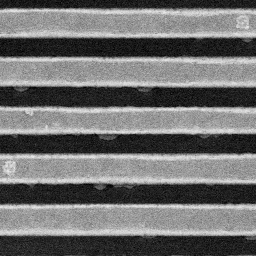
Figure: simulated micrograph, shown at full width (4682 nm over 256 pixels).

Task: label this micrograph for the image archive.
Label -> lines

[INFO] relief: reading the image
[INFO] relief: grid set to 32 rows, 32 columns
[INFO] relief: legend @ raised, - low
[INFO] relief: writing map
--------------------------------
@@@@@@@@@@@@@@@@@@@@@@@@@@@@@@@@
@@@@@@@@@@@@@@@@@@@@@@@@@@@@@@@@
@@@@@@@@@@@@@@@@@@@@@@@@@@@@@@@@
@@@@@@@@@@@@@@@@@@@@@@@@@@@@@@@@
--------------------------------
--------------------------------
@@@@@@@@@@@@@@@@@@@@@@@@@@@@@@@@
@@@@@@@@@@@@@@@@@@@@@@@@@@@@@@@@
@@@@@@@@@@@@@@@@@@@@@@@@@@@@@@@@
@@@@@@@@@@@@@@@@@@@@@@@@@@@@@@@@
--------------------------------
--------------------------------
@@@@@@@@@----@@@@@@@@@@@@@@-----
@@@@@@@@@@@@@@@@@@@@@@@@@@@@@@@@
@@@@@@@@@@@@@@@@@@@@@@@@@@@@@@@@
@@@@@@@@@@@@@@@@@@@@@@@@@@@@@@@@
--------------------------------
--------------------------------
@@@@@@@@@@@@@@@@@@@@@@@@@@@@@@@@
@@@@@@@@@@@@@@@@@@@@@@@@@@@@@@@@
@@@@@@@@@@@@@@@@@@@@@@@@@@@@@@@@
@@@@@@@@@@@@@@@@@@@@@@@@@@@@@@@@
--------------------------------
--------------------------------
--------------------------------
@@@@@@@@@@@@@@@@@@@@@@@@@@@@@@@@
@@@@@@@@@@@@@@@@@@@@@@@@@@@@@@@@
@@@@@@@@@@@@@@@@@@@@@@@@@@@@@@@@
--------------------------------
--------------------------------
--------------------------------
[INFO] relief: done